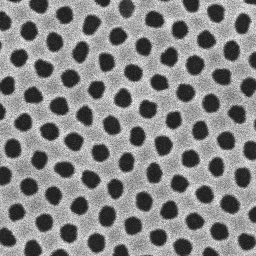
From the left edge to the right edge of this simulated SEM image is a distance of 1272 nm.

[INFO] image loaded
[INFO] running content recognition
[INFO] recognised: a regular array of holes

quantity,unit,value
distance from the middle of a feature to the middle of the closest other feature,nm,136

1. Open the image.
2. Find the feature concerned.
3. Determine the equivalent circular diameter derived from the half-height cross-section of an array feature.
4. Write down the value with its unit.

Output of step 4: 0.093 um